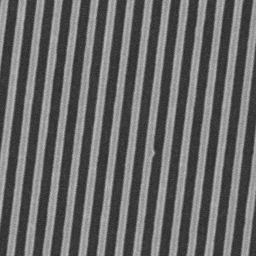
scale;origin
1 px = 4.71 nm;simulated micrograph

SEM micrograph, parallel lines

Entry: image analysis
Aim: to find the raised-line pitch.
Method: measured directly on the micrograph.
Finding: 17.9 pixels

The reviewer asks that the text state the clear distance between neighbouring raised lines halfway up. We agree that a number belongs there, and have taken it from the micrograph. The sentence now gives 0.0509 microns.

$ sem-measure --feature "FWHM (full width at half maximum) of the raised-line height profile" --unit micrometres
0.0328